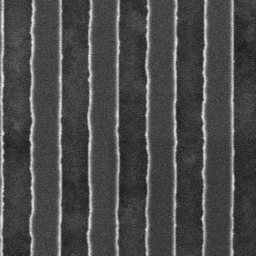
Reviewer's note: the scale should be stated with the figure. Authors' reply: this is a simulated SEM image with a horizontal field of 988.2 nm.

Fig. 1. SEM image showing lines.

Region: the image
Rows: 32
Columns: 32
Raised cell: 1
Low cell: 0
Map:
00001111000111100011110000111000
00001111000111100011110000111000
00001111000111100011110000111000
00001111000111100011110000111000
00001111000111100011110000111000
00001111000111100011110000111000
00001111000111100011110001111000
00001111000111100011110001111000
00001111000111100011110001111000
00001111000111100011110001111000
00001111000111100011110001111000
00001111000111100011110001111000
00001111000111100011110001111000
00001111000111100011110001111000
00001111000111100011110001111000
00001111000111100011110001111000
00001111000111100011110001111000
00001111000111100011110001111000
00001111000111100011110001111000
00001111000111100011110001111000
00001111000111100011110001111000
00001111000111100011110001111000
00001111000111100011110001111000
00001111000111100011110001111000
00001111000111100011110001111000
00001111000111100011110001111000
00001111000111100011110001111000
00001111000111100011110001111000
00001111000111100011110001111000
00001111000111100011110001111000
00001111000111100011110001111000
00001111000111100011110001111000